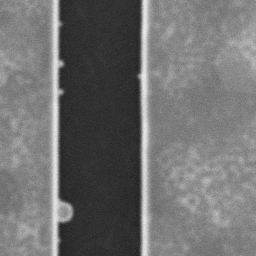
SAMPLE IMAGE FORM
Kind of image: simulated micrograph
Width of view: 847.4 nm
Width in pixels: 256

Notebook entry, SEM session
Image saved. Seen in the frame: one or a few lines or trenches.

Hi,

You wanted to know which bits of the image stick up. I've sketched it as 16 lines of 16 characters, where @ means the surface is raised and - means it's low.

@@@------@@@@@@@
@@@------@@@@@@@
@@@------@@@@@@@
@@@------@@@@@@@
@@@------@@@@@@@
@@@------@@@@@@@
@@@------@@@@@@@
@@@------@@@@@@@
@@@------@@@@@@@
@@@------@@@@@@@
@@@------@@@@@@@
@@@------@@@@@@@
@@@------@@@@@@@
@@@------@@@@@@@
@@@------@@@@@@@
@@@------@@@@@@@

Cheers